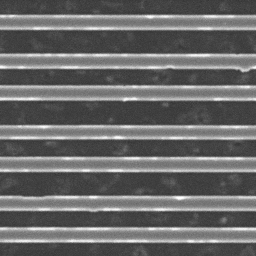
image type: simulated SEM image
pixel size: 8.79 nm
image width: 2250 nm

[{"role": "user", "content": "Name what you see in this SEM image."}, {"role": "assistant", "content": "parallel lines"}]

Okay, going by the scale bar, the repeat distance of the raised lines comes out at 311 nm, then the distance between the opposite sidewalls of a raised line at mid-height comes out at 127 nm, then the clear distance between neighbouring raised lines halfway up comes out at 187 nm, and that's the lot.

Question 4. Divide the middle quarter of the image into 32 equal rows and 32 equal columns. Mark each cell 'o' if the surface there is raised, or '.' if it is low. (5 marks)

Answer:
oooooooooooooooooooooooooooooooo
................................
................................
................................
................................
................................
oooooooooooooooooooooooooooooooo
oooooooooooooooooooooooooooooooo
oooooooooooooooooooooooooooooooo
................................
................................
................................
................................
................................
................................
................................
oooooooooooooooooooooooooooooooo
oooooooooooooooooooooooooooooooo
oooooooooooooooooooooooooooooooo
................................
................................
................................
................................
oooooooooooooooooooooooooooooooo
oooooooooooooooooooooooooooooooo
oooooooooooooooooooooooooooooooo
oooooooooooooooooooooooooooooooo
................................
................................
................................
................................
................................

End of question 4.